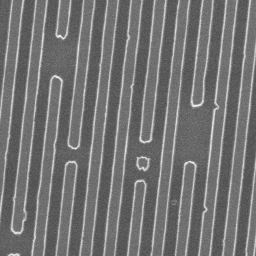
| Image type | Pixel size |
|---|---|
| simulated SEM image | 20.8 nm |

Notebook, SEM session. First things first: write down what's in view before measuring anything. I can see parallel lines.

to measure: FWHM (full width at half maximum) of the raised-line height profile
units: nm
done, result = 227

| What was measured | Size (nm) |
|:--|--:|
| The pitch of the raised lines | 491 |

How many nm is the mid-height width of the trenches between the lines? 263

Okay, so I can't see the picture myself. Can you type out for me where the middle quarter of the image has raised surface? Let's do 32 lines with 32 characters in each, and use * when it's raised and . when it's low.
...***...***...***...***...**...
...***...***...***...**....**...
...**....**....***...**....**...
...**....**....**....**....**...
...**....**....**...***....**...
...**....**....**...***...***...
..***....**...***...***...***...
..***....**...***...***...***...
..***...***...***...***...***...
..***...***...***...***...***...
..***...***...**....***...***...
..***...**....***...***...**....
..***...**....**....**....**....
..**....**....**....**....**....
..**....**...***....**....**....
..**...***...***....**...***....
.***...***...***...***...***....
.***...***...***...***...***....
.***...***...***...***...***....
.***...***...***....*....***....
..**...***...**..........**.....
.......***...**..........**.....
.......**....**..........**.....
.......**....**....*.....**.....
.*....***....**...***...***....*
***...***....**...***...***...**
***...***...***.........***...**
***...***...***.........***...**
***...***...***.........***...**
***...***...***...**....***...**
**....***...***...**....**....**
**....***...**....**....**....**